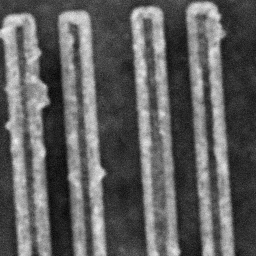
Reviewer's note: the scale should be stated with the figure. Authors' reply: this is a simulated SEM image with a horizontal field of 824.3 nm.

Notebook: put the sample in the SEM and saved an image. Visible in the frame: parallel lines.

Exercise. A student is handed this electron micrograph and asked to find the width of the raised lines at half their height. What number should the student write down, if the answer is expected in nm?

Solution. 72.3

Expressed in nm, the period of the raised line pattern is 196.